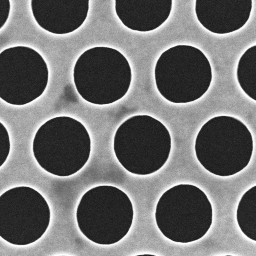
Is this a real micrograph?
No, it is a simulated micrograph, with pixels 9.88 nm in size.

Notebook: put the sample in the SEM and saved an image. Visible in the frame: holes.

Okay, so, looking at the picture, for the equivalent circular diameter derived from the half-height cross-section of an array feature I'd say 575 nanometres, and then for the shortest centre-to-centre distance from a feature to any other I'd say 784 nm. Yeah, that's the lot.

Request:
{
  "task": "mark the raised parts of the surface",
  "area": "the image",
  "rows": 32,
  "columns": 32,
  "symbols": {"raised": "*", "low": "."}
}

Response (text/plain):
.***.......***........**........
.***.......***.......****......*
.***.......****......****......*
*****.....******....******....**
********************************
********************************
.....******....*****.....******.
.....*****......****......****..
......***.......***.......****..
......***.......***.......****..
......***.......****......****..
.....*****......****......*****.
....*******....******....*******
********************************
*****************..*************
******....*****.....******....**
.****......***.......****......*
.***.......***.......****.......
.***.......***.......***........
.***.......****......****......*
*****......****......****......*
******...*******...*******....**
********************************
**..********...******....******.
.....*****......****......****..
......****......****......****..
......****.......**........***..
......****.......**........***..
......****......****......****..
.....******.....*****....******.
**..********..******************
********************************